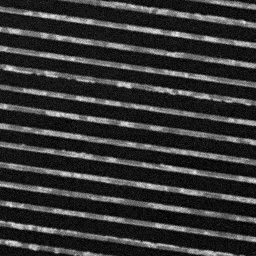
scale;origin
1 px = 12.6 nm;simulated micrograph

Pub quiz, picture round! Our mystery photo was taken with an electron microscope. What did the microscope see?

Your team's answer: parallel lines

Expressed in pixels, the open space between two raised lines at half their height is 15.2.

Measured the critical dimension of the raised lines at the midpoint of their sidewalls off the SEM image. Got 48.3 nm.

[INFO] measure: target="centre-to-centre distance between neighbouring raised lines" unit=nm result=243